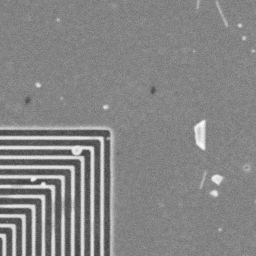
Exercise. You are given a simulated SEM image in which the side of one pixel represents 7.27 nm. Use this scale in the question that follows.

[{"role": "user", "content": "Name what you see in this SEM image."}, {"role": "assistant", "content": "groups of lines, slits or small figures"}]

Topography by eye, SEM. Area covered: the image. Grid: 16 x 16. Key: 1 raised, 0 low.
1111111111111111
1111111111111111
1111111111111111
1111111111111111
1111111111111111
1111111111111111
1111111111111111
1111111111111111
0000000111111111
0000000111111111
0000000111111111
0000000111111111
0000000111111111
0000000111111111
1000000111111111
0000000111111111